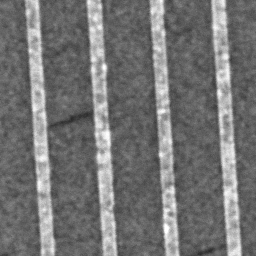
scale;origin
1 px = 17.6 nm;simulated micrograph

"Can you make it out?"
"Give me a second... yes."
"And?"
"one or a few lines or trenches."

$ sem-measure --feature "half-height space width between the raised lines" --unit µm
0.901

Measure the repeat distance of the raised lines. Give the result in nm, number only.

1090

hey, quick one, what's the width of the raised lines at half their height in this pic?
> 193 nanometers